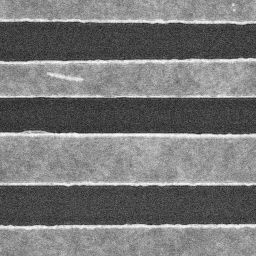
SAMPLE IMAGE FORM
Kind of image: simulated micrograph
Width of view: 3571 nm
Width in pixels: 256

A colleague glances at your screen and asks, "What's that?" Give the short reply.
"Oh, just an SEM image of lines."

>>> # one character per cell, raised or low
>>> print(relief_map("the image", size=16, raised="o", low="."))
oooooooooooooooo
................
................
................
oooooooooooooooo
oooooooooooooooo
................
................
oooooooooooooooo
oooooooooooooooo
oooooooooooooooo
.o.oo..oooooo..o
................
................
oooooooooooooooo
oooooooooooooooo